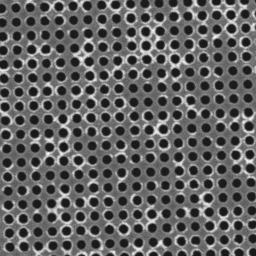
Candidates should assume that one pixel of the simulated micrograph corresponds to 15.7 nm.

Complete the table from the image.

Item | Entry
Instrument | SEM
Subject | a regular array of holes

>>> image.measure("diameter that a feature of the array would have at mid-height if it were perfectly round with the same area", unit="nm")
153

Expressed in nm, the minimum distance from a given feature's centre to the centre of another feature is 216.